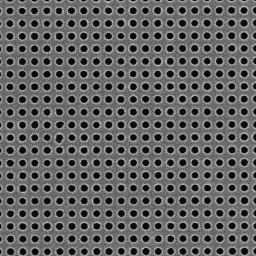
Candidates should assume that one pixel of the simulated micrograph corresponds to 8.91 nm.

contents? a regular array of holes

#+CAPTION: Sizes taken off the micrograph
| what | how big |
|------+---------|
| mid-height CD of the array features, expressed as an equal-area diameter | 60.3 nanometres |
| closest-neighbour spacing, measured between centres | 109 nanometres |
